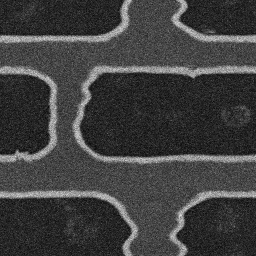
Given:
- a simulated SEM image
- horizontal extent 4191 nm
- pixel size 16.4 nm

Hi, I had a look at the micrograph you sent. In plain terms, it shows one or a few lines or trenches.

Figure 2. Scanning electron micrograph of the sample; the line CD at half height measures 0.627 um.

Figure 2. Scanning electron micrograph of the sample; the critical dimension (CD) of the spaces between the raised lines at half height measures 1440 nm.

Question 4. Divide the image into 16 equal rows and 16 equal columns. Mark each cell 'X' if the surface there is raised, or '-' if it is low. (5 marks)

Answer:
--------XXX-----
--------XXX-----
XXXXXXXXXXXXXXXX
XXXXXXXXXXXXXXXX
--XXXX------X---
---XX-----------
---XX-----------
---XX-----------
---XX-----------
---XXX----------
XXXXXXXXXXXXXXXX
XXXXXXXXXXXXXXXX
-------XXXXX----
--------XXX-----
--------XXX-----
--------XXX-----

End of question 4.